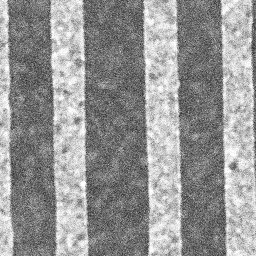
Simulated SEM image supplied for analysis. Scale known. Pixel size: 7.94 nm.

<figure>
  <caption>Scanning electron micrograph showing one or a few lines or trenches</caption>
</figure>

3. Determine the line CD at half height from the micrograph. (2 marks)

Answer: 30.1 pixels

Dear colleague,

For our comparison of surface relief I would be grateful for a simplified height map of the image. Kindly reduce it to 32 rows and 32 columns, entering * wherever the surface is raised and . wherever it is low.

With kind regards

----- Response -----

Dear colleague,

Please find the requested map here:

*.....****........****......***.
*.....****........****......***.
*.....****........****......***.
*......***........****......***.
*......***........****......***.
*......***........****......***.
*......***........****......***.
*......***........****......***.
*.*....***........****......***.
*......***........****......***.
*......***........****......***.
*......***........****......****
*......***........****......****
*......***........****......****
*......***........****......****
*......****.......****......****
***....****.......****......****
**.....****.......****......****
*......***.........***......****
*......****.......*****.....****
*......****...*...****......****
*......****........***......****
*......****........***......****
*......****........***......****
*......****........***......****
*......****........***......****
*......****........***......****
*......****........***......****
*......****........****.....****
**.....****........****.....****
**.....****........****.....****
*......****........****.....****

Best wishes